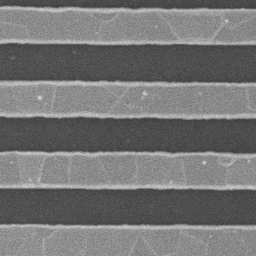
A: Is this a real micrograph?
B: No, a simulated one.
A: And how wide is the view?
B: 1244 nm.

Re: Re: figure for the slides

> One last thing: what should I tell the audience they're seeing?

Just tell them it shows lines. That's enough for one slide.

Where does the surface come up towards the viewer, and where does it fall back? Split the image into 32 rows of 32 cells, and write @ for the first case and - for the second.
--------------------------------
@@@@@@@@@@@@@@@@@@@@@@@@@@@@@@@@
@@@@@@@@@@@@@@@@@@@@@@@@@@@@@@@@
@@@@@@@@@@@@@@@@@@@@@@@@@@@@@@@@
@@@@@@@@@@@@@@@@@@@@@@@@@@@@@@@@
-----------@@@@@@@--@@-@@@@@@@@@
--------------------------------
--------------------------------
--------------------------------
--------------------------------
@@@@@@@@@@@@@@@@@@@@@@@@@@@@@@@@
@@@@@@@@@@@@@@@@@@@@@@@@@@@@@@@@
@@@@@@@@@@@@@@@@@@@@@@@@@@@@@@@@
@@@@@@@@@@@@@@@@@@@@@@@@@@@@@@@@
@@@@@@@@@@@@@@@@@@@@@@@@@@@@@@@@
--------------------------------
--------------------------------
--------------------------------
--------------------------------
@@@@@@@@@@@@@@@@@@@@@@@@@@@@@@@@
@@@@@@@@@@@@@@@@@@@@@@@@@@@@@@@@
@@@@@@@@@@@@@@@@@@@@@@@@@@@@@@@@
@@@@@@@@@@@@@@@@@@@@@@@@@@@@@@@@
----------@@@-@@@--@@@@@@@@@@@@@
--------------------------------
--------------------------------
--------------------------------
--------------------------------
@@@@@@@@@@@@@@@@@@@@@@@@@@@@@@@@
@@@@@@@@@@@@@@@@@@@@@@@@@@@@@@@@
@@@@@@@@@@@@@@@@@@@@@@@@@@@@@@@@
@@@@@@@@@@@@@@@@@@@@@@@@@@@@@@@@